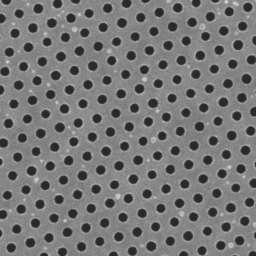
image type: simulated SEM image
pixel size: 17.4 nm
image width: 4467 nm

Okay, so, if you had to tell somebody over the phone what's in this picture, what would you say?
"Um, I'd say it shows a regular array of holes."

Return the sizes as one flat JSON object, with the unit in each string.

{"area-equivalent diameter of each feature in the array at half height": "0.168 µm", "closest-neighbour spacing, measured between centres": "333 nanometres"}